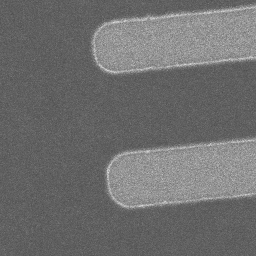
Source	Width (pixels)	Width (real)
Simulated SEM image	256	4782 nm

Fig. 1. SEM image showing one or a few lines or trenches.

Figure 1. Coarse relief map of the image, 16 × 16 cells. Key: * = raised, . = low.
****************
*******.........
******..........
******..........
****************
****************
****************
****************
****************
*********.......
*******.........
*******.........
*******.....****
****************
****************
****************